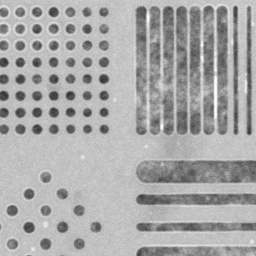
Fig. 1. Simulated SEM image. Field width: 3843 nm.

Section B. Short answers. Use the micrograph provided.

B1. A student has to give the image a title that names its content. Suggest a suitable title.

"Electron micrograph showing groups of lines, slits or small figures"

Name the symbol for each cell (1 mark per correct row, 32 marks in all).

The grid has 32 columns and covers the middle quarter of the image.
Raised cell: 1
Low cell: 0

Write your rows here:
10111001100111111100000000000000
11111111111111111100000000000000
11111111111111111100000000000000
00011001100111111100000000000000
10011001100111111100000000000000
11111111111111111100000000000000
11111111111111111100000000000000
00011001100111111100000000000000
00011001100111111100000000000000
11111111111111111100000000000000
11111111111111111100000000000000
00011001100111111100000000000000
00011001100111111100000000000000
11111111111111111100000000000000
11111111111111111100000000000000
10111001100111111100000000000000
00011001100111111100000000000000
10111111111111111100110010010011
11111111111111111111111111111111
11111111111111111111111111111111
11111111111111111111111111111111
11111111111111111111111111111111
11111111111111111111111111111111
11111111111111111111111111111111
11111111111111111110000000000000
11111111111111111100000000000000
11111111111111111100000000000000
11111111111111111100000000000000
11111111111111111100000000000000
11111111111111111110000000000000
11111111111111111111111111111111
01111111111111111111111111111111